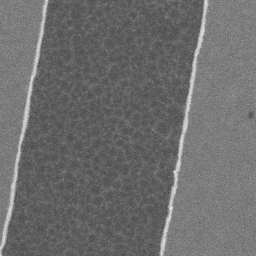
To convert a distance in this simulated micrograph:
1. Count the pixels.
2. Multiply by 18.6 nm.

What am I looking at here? one or a few lines or trenches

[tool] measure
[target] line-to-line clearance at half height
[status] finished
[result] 2940 nm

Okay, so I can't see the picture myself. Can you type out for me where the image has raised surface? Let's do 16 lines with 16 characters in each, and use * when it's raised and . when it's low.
***..........***
***..........***
***..........***
**..........****
**..........****
**..........****
**..........****
**..........****
*..........*****
*..........*****
*..........*****
*..........*****
*..........*****
*..........*****
..........******
..........******